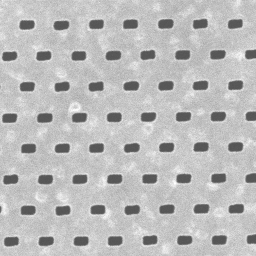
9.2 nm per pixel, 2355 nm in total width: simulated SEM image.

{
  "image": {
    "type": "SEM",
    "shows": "a regular array of holes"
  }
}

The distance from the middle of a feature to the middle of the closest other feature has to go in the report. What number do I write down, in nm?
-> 317